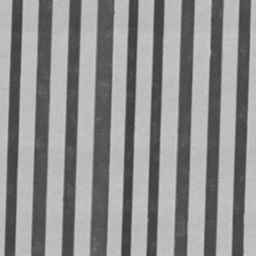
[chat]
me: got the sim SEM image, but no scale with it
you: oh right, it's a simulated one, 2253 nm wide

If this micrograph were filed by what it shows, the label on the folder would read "parallel lines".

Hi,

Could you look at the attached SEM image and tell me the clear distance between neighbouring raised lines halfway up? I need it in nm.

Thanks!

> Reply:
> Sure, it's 104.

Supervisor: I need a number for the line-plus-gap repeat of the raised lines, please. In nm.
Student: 252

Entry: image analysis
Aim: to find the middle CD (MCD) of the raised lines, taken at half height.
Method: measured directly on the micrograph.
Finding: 16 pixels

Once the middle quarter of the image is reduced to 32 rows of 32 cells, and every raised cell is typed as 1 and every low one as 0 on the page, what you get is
10001111000011110011110001111000
10001111000011110011110001111000
10001111000011110011110001111000
10001111000011110011110001111000
10001111000011110011110001111000
10001110000011100011110001111000
10001111000011100011110001111000
00001111000011100011110001110000
00001111000011100011110011110000
00001111000011100011110011110000
00001111000011100011110011110000
00001111000011100011110011110000
00001110000011100011110011110000
00011110000011100011110011110000
00011110000011100011110011110000
00011110000011100011110011110000
00011110000011100011100011110000
00011110000011100011100011110000
00011110000011100011100011110000
00011110000011100011100011110000
00011110000011100011100011110000
00011110000011100011100011110000
00011110000011100011100011110000
00011110000011100111100011110000
00011110000011100111100011110000
00011110000011100111100011110000
00011110000111100111100011110000
00011110000111100111100011110001
00011110000111100111100011110001
00011110000111100111100011110001
00011110000111100111100011110001
00011110000111100111100011110001